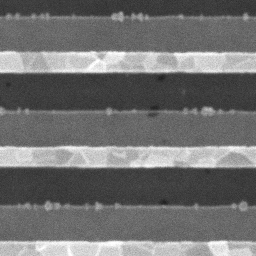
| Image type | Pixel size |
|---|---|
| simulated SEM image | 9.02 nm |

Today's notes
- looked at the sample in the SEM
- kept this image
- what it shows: lines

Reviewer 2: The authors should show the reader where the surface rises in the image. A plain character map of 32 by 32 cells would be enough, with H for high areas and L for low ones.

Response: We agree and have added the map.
LLLLLLLLLLLLLLLLLLLLLLLLLLLLLLLL
LLLLLLLLLLLLLLLLLLLLLLLLLLLLLLLL
HHHHHHHHHHHHHHHHHHHHHHHHHHHHHHHH
HHHHHHHHHHHHHHHHHHHHHHHHHHHHHHHH
HHHHHHHHHHHHHHHHHHHHHHHHHHHHHHHH
HHHHHHHHHHHHHHHHHHHHHHHHHHHHHHHH
HHHHHHHHHHHHHHHHHHHHHHHHHHHHHHHH
HHHHHHHHHHHHHHHHHHHHHHHHHHHHHHHH
HHHHHHHHHHHHHHHHHHHHHHHHHHHHHHHH
LLLLLLLLLLLLLLLLLLLLLLLLLLLLLLLL
LLLLLLLLLLLLLLLLLLLLLLLLLLLLLLLL
LLLLLLLLLLLLLLLLLLLLLLLLLLLLLLLL
LLLLLLLLLLLLLLLLLLLLLLLLLLLLLLLL
LLLLLLLLLLLLLLLLLLLLLLLLLLLLLLLL
HHHHHHHHHHHHHHHHHHHHHHHHHHHHHHHH
HHHHHHHHHHHHHHHHHHHHHHHHHHHHHHHH
HHHHHHHHHHHHHHHHHHHHHHHHHHHHHHHH
HHHHHHHHHHHHHHHHHHHHHHHHHHHHHHHH
HHHHHHHHHHHHHHHHHHHHHHHHHHHHHHHH
HHHHHHHHHHHHHHHHHHHHHHHHHHHHHHHH
HHHHHHHHHHHHHHHHHHHHHHHHHHHHHHHH
LLLLLLLLLLLLLLLLLLLLLLLLLLLLLLLL
LLLLLLLLLLLLLLLLLLLLLLLLLLLLLLLL
LLLLLLLLLLLLLLLLLLLLLLLLLLLLLLLL
LLLLLLLLLLLLLLLLLLLLLLLLLLLLLLLL
LLLLLLHLLLLLHLLLLLLLLLLLLLLLLLHL
HHHHHHHHHHHHHHHHHHHHHHHHHHHHHHHH
HHHHHHHHHHHHHHHHHHHHHHHHHHHHHHHH
HHHHHHHHHHHHHHHHHHHHHHHHHHHHHHHH
HHHHHHHHHHHHHHHHHHHHHHHHHHHHHHHH
HHHHHHHHHHHHHHHHHHHHHHHHHHHHHHHH
HHHHHHHHHHHHHHHHHHHHHHHHHHHHHHHH